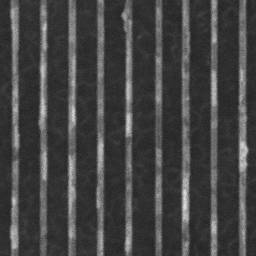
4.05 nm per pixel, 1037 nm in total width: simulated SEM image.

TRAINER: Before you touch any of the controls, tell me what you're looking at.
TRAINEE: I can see parallel lines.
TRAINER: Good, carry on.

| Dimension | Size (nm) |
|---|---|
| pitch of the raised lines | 115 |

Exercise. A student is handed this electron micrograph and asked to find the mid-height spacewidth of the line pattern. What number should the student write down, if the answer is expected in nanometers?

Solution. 91.2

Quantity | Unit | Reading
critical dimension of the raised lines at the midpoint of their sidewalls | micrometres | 0.0228